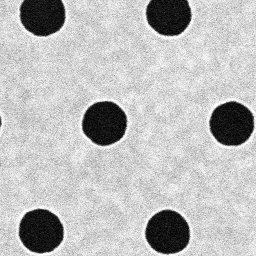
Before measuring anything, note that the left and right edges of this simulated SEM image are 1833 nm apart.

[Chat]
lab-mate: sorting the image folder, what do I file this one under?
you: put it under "holes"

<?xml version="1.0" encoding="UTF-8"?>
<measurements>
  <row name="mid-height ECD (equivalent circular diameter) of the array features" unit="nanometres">327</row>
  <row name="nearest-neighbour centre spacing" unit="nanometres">900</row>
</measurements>